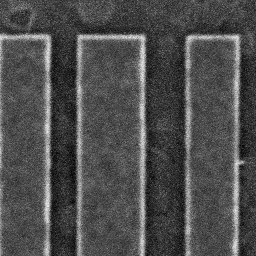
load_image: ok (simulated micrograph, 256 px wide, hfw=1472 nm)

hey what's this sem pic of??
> one or a few lines or trenches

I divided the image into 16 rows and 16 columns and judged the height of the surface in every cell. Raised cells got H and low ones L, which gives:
LLLLLLLLLLLLLLLL
LLLLLLLLLLLLLLLL
HHHLLHHHHLLLHHHL
HHHLLHHHHLLLHHHL
HHHLLHHHHLLLHHHL
HHHLLHHHHLLLHHHL
HHHLLHHHHLLLHHHL
HHHLLHHHHLLLHHHL
HHHLLHHHHLLLHHHL
HHHLLHHHHLLLHHHL
HHHLLHHHHLLLHHHL
HHHLLHHHHLLLHHHL
HHHLLHHHHLLLHHHL
HHHLLHHHHLLLHHHL
HHHLLHHHHLLLHHHL
HHHLLHHHHLLLHHHL